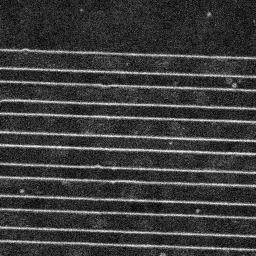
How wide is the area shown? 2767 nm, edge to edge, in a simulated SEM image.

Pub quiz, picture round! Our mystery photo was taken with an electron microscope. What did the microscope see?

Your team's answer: parallel lines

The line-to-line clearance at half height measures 0.194 microns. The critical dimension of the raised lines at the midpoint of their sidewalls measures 0.148 um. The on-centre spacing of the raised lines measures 344 nm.